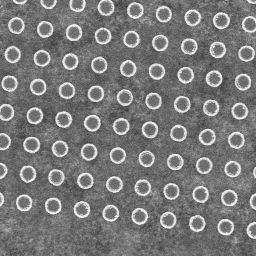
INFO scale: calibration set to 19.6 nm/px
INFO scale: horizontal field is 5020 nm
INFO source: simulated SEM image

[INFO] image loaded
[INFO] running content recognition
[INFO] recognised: a regular array of raised bodies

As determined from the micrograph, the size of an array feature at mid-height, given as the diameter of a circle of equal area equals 290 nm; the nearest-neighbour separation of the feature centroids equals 565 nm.